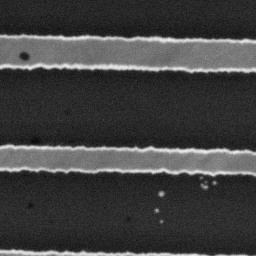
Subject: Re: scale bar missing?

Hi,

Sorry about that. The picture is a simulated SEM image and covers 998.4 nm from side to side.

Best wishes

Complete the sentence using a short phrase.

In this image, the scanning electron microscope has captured lines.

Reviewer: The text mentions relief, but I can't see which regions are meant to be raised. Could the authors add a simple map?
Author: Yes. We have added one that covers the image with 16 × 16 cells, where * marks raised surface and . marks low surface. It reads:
................
................
***************.
****************
................
................
................
................
................
****************
****************
................
................
................
................
................